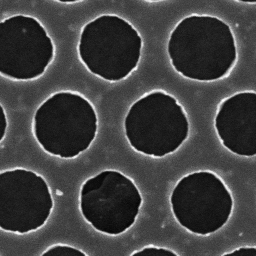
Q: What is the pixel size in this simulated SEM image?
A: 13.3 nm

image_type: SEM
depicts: holes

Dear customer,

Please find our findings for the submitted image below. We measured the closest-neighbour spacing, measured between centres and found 1190 nm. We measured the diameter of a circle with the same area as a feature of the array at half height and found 833 nm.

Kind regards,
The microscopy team